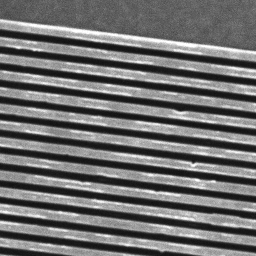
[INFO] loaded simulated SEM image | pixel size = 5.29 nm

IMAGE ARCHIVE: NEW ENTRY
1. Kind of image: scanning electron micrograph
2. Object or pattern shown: parallel lines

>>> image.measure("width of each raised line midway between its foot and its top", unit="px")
9.68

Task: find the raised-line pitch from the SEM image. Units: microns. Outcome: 0.0877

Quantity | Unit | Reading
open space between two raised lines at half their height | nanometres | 36.7